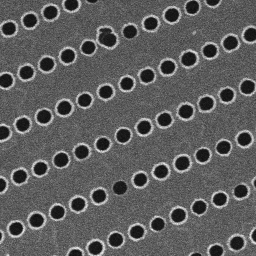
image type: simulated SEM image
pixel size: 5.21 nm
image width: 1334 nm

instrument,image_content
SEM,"a regular array of holes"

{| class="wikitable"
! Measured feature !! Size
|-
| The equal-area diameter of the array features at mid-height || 71.4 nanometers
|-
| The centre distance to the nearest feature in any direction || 0.115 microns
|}